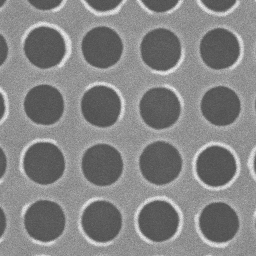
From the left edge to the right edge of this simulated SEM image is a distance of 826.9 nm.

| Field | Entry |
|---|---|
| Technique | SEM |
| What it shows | a regular array of holes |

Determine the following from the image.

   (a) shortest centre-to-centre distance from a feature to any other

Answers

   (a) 185 nm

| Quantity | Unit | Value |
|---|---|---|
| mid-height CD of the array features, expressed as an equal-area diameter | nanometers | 133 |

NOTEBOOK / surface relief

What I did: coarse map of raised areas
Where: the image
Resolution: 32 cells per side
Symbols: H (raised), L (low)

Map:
HHHHLLLLHHHLLLLHHHLLLLHHHLLLLHHH
HHHHHHHHHHHHHHHHHHHHHHHHHHHHHHHH
HHHHHHHHHHHHHHHHHHHHHHHHHHHHHHHH
HHHHHLHHHHHHLLHHHHHHHHHHHHHHHHHH
HHHLLLLLHHHLLLLHHHLLLLHHHHLLLHHH
LHHLLLLLHHLLLLLHHHLLLLLHHLLLLLHH
LHHLLLLLHHLLLLLHHHLLLLLHHLLLLLHH
LHHHLLLLHHHLLLLHHHLLLLHHHLLLLLHH
HHHHHHHHHHHHLHHHHHHLLHHHHHHLHHHH
HHHHHHHHHHHHHHHHHHHHHHHHHHHHHHHH
HHHHHHHHHHHHHHHHHHHHHHHHHHHHHHHH
HHHHLLLHHHHLLLHHHHLLLLHHHHLLLHHH
HHHLLLLLHHLLLLLHHHLLLLHHHLLLLLHH
LHHLLLLLHHLLLLLHHLLLLLLHHLLLLLHH
HHHLLLLLHHLLLLLHHHLLLLHHHLLLLLHH
HHHHHLLHHHHLLLHHHHLLLLHHHHHLLHHH
HHHHHHHHHHHHHHHHHHHHHHHHHHHHHHHH
HHHHHHHHHHHHHHHHHHHHHHHHHHHHHHHH
HHHHLLLHHHHLLLHHHHLLLLHHHHLLHHHH
LHHLLLLLHHLLLLLHHHLLLLLHHLLLLHHH
LHHLLLLLHHLLLLLHHLLLLLLHHLLLLLHH
LHHLLLLLHHLLLLLHHHLLLLLHHLLLLLHH
HHHHLLLHHHHLLLLHHHLLLLHHHLLLLHHH
HHHHHHHHHHHHHHHHHHHHHHHHHHHHHHHH
HHHHHHHHHHHHHHHHHHHHHHHHHHHHHHHH
HHHHLLLHHHHLLLHHHHLLLHHHHHLLHHHH
HHHLLLLLHHLLLLLHHHLLLLHHHLLLLHHH
LHHLLLLLHHLLLLLHHLLLLLHHHLLLLLHH
LHHLLLLLHHLLLLLHHLLLLLHHHLLLLLHH
HHHHLLLHHHHLLLLHHHLLLLHHHHLLLHHH
HHHHHHHHHHHHHHHHHHHHHHHHHHHHHHHH
HHHHHHHHHHHHHHHHHHHHHHHHHHHHHHHH